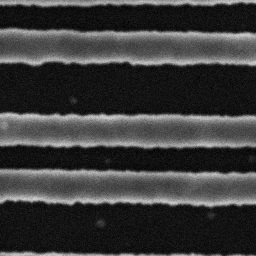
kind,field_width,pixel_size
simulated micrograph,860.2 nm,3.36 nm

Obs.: lines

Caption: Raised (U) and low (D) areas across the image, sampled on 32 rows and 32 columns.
UUUUUUUUUUUUUUUUUUDUUUUUUUUDUDDD
DDDDDDDDDDDDDDDDDDDDDDDDDDDDDDDD
DDDDDDDDDDDDDDDDDDDDDDDDDDDDDDDD
DDDDDDDDDDDDDDDDDDDDDDDDDDDDDDDD
UUUUUUUUUUUUUUUUUUUUUUUUUUUUUUUU
UUUUUUUUUUUUUUUUUUUUUUUUUUUUUUUU
UUUUUUUUUUUUUUUUUUUUUUUUUUUUUUUU
UUUUUUUUUUUUUUUUUUUUUUUUUUUUUUUU
DDDDDDDDDDDDDDDDDDDDDDDDDDDDDDDD
DDDDDDDDDDDDDDDDDDDDDDDDDDDDDDDD
DDDDDDDDDDDDDDDDDDDDDDDDDDDDDDDD
DDDDDDDDDDDDDDDDDDDDDDDDDDDDDDDD
DDDDDDDDDDDDDDDDDDDDDDDDDDDDDDDD
DDDDDDDDDDDDDDDDDDDDDDDDDDDDDDDD
UUUUUUUUUUDUUDUUDUUUUUUDDDDDDDDD
UUUUUUUUUUUUUUUUUUUUUUUUUUUUUUUU
UUUUUUUUUUUUUUUUUUUUUUUUUUUUUUUU
UUUUUUUUUUUUUUUUUUUUUUUUUUUUUUUU
DDDDDDDDDDDDDDDDDDUDDDUDDDDDDDDD
DDDDDDDDDDDDDDDDDDDDDDDDDDDDDDDD
DDDDDDDDDDDDDDDDDDDDDDDDDDDDDDDD
UUUUUUUUUUUUUUUUUUDDDUDDDDDDDDDD
UUUUUUUUUUUUUUUUUUUUUUUUUUUUUUUU
UUUUUUUUUUUUUUUUUUUUUUUUUUUUUUUU
UUUUUUUUUUUUUUUUUUUUUUUUUUUUUUUU
DDDDDDDDUDDDDDDDDDDDDUDUUUUUUUUU
DDDDDDDDDDDDDDDDDDDDDDDDDDDDDDDD
DDDDDDDDDDDDDDDDDDDDDDDDDDDDDDDD
DDDDDDDDDDDDDDDDDDDDDDDDDDDDDDDD
DDDDDDDDDDDDDDDDDDDDDDDDDDDDDDDD
DDDDDDDDDDDDDDDDDDDDDDDDDDDDDDDD
DDDDDDDDDDDDDDDDDDDDDDDDDDDDDDDD